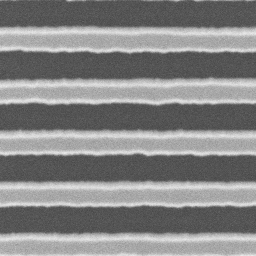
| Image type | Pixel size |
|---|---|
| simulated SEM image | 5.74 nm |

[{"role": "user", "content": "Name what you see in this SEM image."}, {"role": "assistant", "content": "lines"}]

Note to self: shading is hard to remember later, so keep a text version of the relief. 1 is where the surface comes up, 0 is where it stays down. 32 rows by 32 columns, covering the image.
00000000000000000000000000000000
00000000000000000000000000000000
00000000000000000000000000000000
00000000000000000000000000000000
11111111111111111111111111111111
11111111111111111111111111111111
00000000000010001000100000000000
00000000000000000000000000000000
00000000000000000000000000000000
00000000000000000000000000000000
11111111111111111111111111111111
11111111111111111111111111111111
11111111111111111111111111111111
00000000000000000000000000000000
00000000000000000000000000000000
00000000000000000000000000000000
00000000000000000000001000000000
11111111111111111111111111111111
11111111111111111111111111111111
00000000000000000000000001000000
00000000000000000000000000000000
00000000000000000000000000000000
00000000000000000000000000000000
11111111111111111111111111111111
11111111111111111111111111111111
11111111111111111111111111111111
00000000000000000000000000000000
00000000000000000000000000000000
00000000000000000000000000000000
00111100000000011010000000010100
11111111111111111111111111111111
11111111111111111111111111111111